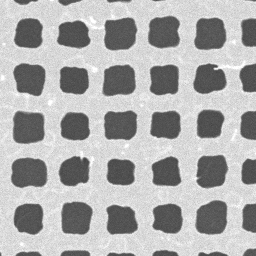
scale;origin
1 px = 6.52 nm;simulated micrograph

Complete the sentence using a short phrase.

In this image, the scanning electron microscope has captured a regular array of holes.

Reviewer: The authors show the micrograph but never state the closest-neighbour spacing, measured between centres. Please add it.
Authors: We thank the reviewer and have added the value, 291 nanometers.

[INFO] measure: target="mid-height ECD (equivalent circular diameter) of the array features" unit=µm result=0.206